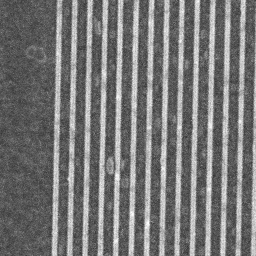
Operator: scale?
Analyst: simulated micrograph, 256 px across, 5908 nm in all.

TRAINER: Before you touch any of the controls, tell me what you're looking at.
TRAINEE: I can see parallel lines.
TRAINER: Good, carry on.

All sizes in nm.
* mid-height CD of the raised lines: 89.4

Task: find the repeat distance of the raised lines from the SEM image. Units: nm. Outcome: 353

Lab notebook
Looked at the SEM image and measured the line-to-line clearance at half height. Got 0.265 um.